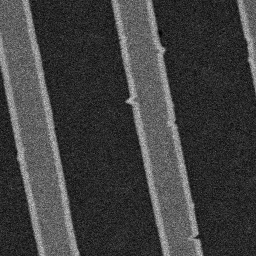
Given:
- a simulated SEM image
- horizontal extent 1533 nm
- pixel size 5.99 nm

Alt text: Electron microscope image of one or a few lines or trenches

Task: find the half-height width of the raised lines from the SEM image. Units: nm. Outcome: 201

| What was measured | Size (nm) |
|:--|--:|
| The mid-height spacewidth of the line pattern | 528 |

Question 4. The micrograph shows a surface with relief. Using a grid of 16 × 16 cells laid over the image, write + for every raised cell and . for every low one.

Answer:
++.....++......+
++.....+++.....+
++......++......
++......++......
++......++......
.++.....++......
.++.....+++.....
.++......++.....
.++......++.....
.++......++.....
.+++.....++.....
..++.....+++....
..++......++....
..++......++....
..++......++....
...++.....++....